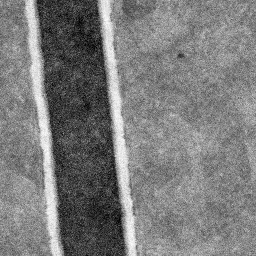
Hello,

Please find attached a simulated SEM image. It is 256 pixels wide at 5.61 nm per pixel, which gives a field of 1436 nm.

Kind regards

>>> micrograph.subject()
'one or a few lines or trenches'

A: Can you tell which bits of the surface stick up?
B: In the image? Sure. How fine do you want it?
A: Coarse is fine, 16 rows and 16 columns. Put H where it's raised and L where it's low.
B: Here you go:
HHLLLLLHHHHHHHHH
HHLLLLLHHHHHHHHH
HHLLLLLHHHHHHHHH
HHLLLLLHHHHHHHHH
HHLLLLLHHHHHHHHH
HHLLLLLHHHHHHHHH
HHLLLLLHHHHHHHHH
HHHLLLLHHHHHHHHH
HHHLLLLLHHHHHHHH
HHHLLLLLHHHHHHHH
HHHLLLLLHHHHHHHH
HHHLLLLLHHHHHHHH
HHHLLLLLHHHHHHHH
HHHLLLLLHHHHHHHH
HHHLLLLLHHHHHHHH
HHHLLLLLHHHHHHHH